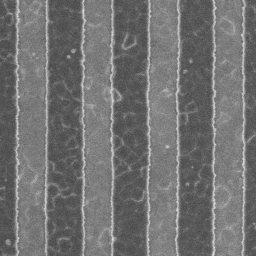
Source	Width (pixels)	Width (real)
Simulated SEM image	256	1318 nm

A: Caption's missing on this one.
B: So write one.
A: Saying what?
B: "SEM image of one or a few lines or trenches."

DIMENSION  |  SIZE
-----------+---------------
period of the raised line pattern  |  337 nanometers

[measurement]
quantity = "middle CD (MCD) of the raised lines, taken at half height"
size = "173 nanometres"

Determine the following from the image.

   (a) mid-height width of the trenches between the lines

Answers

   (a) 146 nanometres